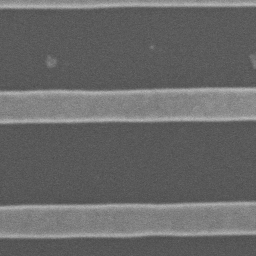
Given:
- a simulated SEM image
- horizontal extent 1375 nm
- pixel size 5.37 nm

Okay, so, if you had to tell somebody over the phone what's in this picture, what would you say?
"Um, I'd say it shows wiring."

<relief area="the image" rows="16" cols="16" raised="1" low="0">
0000000000000000
0000000000000000
0000000000000000
0000000000000000
0000000000000000
0000000000000000
1111111111111111
1111111111111110
0000000000000000
0000000000000000
0000000000000000
0000000000000000
0000000000000000
1111111111111111
1111111111111111
0000000000000000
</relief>